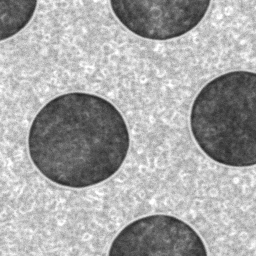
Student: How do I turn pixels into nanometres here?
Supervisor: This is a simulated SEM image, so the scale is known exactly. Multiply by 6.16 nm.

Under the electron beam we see holes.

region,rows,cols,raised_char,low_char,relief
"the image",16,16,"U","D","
DDUUUUUDDDDDDUUU
DDUUUUUUDDDDUUUU
UUUUUUUUUUUUUUUU
UUUUUUUUUUUUUUUU
UUUUUUUUUUUUUUDD
UUUUUUUUUUUUUDDD
UUUDDDDUUUUUDDDD
UUDDDDDDUUUUDDDD
UUDDDDDDUUUUDDDD
UUDDDDDDUUUUUDDD
UUDDDDDUUUUUUUUU
UUUUDDUUUUUUUUUU
UUUUUUUUUUUUUUUU
UUUUUUUUUDDUUUUU
UUUUUUUDDDDDUUUU
UUUUUUUDDDDDDUUU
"